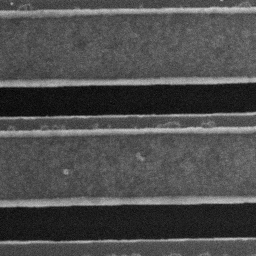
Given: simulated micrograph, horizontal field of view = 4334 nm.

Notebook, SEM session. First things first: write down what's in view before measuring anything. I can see lines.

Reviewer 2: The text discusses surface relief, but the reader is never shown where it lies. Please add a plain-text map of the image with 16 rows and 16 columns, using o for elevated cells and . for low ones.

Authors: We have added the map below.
oooooooooooooooo
oooooooooooooooo
oooooooooooooooo
oooooooooooooooo
oooooooooooooooo
................
................
oooooooooooooooo
oooooooooooooooo
oooooooooooooooo
oooooooooooooooo
oooooooooooooooo
oooooooooooooooo
................
................
oooooooooooooooo